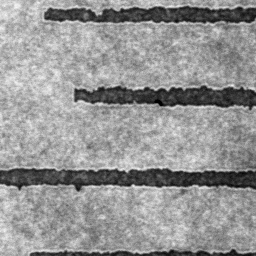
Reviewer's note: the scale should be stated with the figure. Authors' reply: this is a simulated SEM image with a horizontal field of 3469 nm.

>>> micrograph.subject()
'one or a few lines or trenches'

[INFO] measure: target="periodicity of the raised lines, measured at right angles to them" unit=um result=1.11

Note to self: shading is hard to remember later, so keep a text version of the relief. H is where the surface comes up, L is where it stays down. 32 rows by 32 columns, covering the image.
HHHHHHHHHHHHHHHHHHHHHHHHHHHHHHHH
HHHHHLLLLLLLHLLLLLLLLLLLLLLLLLLL
HHHHHHLLLLLLLLLLLLLLLLLLLLLLLLLL
HHHHHHHHHHHHHHHHHHHHHHHHHHHHHHHH
HHHHHHHHHHHHHHHHHHHHHHHHHHHHHHHH
HHHHHHHHHHHHHHHHHHHHHHHHHHHHHHHH
HHHHHHHHHHHHHHHHHHHHHHHHHHHHHHHH
HHHHHHHHHHHHHHHHHHHHHHHHHHHHHHHH
HHHHHHHHHHHHHHHHHHHHHHHHHHHHHHHH
HHHHHHHHHHHHHHHHHHHHHHHHHHHHHHHH
HHHHHHHHHHHHHHHHHHHHHHHHHHHHHHHH
HHHHHHHHHLLLLLLLLLLLLLLLLLLLLLLL
HHHHHHHHHLLLLLLLLLLLLLLLLLLLLLLL
HHHHHHHHHHHHHHHHHHHHHLHHHHHLLHHL
HHHHHHHHHHHHHHHHHHHHHHHHHHHHHHHH
HHHHHHHHHHHHHHHHHHHHHHHHHHHHHHHH
HHHHHHHHHHHHHHHHHHHHHHHHHHHHHHHH
HHHHHHHHHHHHHHHHHHHHHHHHHHHHHHHH
HHHHHHHHHHHHHHHHHHHHHHHHHHHHHHHH
HHHHHHHHHHHHHHHHHHHHHHHHHHHHHHHH
HHHHHHHHHHHHHHHHHHHHHHHHHHHHHHHH
LLLLLLLLLLLLLLLLLLLLLLLLLLLLLLLL
LLLLLLLLLLLLLLLLLLLLLLLLLLLLLLLL
HHLHHHHHHLHHHHHHHHHLLHLHHHHHHLLL
HHHHHHHHHHHHHHHHHHHHHHHHHHHHHHHH
HHHHHHHHHHHHHHHHHHHHHHHHHHHHHHHH
HHHHHHHHHHHHHHHHHHHHHHHHHHHHHHHH
HHHHHHHHHHHHHHHHHHHHHHHHHHHHHHHH
HHHHHHHHHHHHHHHHHHHHHHHHHHHHHHHH
HHHHHHHHHHHHHHHHHHHHHHHHHHHHHHHH
HHHHHHHHHHHHHHHHHHHHHHHHHHHHHHHH
HHHHLLLLLLLHLLLLLLLLLLLLLLLLLLLL